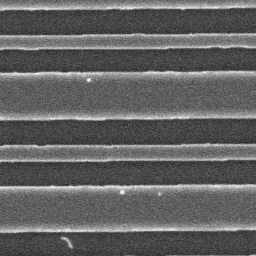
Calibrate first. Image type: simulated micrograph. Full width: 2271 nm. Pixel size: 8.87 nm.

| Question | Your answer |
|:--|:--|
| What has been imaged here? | lines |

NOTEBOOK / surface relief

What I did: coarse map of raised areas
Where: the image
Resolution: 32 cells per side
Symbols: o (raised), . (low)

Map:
oooooooooooooooooooooooooooooooo
................................
................................
................................
..........oooooooooooooooooooooo
oooooooooooooooooooooooooooooooo
................................
................................
................................
oooooooooooooooooooooooooooooooo
oooooooooooooooooooooooooooooooo
oooooooooooooooooooooooooooooooo
oooooooooooooooooooooooooooooooo
oooooooooooooooooooooooooooooooo
oooooooooooooooooooooooooooooooo
................................
................................
................................
oooooooooooooooooooooooooooooooo
oooooooooooooooooooooooooooooooo
................................
................................
................................
oooooooooooooooooooooooooooooooo
oooooooooooooooooooooooooooooooo
oooooooooooooooooooooooooooooooo
oooooooooooooooooooooooooooooooo
oooooooooooooooooooooooooooooooo
oooooooooooooooooooooooooooooooo
................................
................................
................................